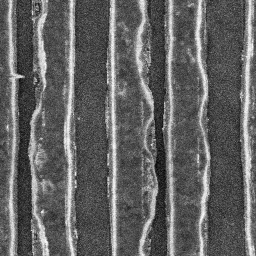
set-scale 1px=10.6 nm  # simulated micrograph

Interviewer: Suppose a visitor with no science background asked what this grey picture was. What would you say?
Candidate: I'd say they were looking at one or a few lines or trenches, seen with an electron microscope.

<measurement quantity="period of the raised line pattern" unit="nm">700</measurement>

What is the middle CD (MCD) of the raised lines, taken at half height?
0.33 micrometres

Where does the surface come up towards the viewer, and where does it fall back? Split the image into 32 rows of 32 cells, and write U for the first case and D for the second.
UDDDDUUUUDDDDDUUUUDDDUUUUDDDDDDU
UDDDDUUUUDDDDDUUUUDDDUUUUDDDDDDU
UDDDDUUUUDDDDDUUUUDDDUUUUDDDDDDU
UDDDDUUUUDDDDDUUUUDDDUUUUDDDDDDU
UDDDDUUUUDDDDDUUUDDDDUUUUDDDDDDU
UDDDDUUUUDDDDDUUUDDDDUUUUDDDDDDU
UDDDDUUUUDDDDDUUUDDDDUUUUDDDDDDU
UDDDDUUUUDDDDDUUUDDDDUUUUDDDDDDU
UDDDDUUUUDDDDDUUUDDDDUUUUDDDDDDU
UUDDDUUUUDDDDDUUUUDDDUUUUDDDDDDU
UUDDDDUUUDDDDDUUUUDDDUUUUUDDDDDU
UUDDDUUUUDDDDDUUUUDDDUUUUUDDDDDU
UUDDDUUUUDDDDDUUUUUDDUUUUDDDDDDU
UUDDDUUUUDDDDDUUUUUDDUUUUDDDDDDU
UUDDUUUUUDDDDDUUUUUDDUUUUDDDDDDU
UUDDUUUUUDDDDDUUUUUDDUUUUDDDDDDU
UUDDUUUUDDDDDDUUUUDDDUUUUDDDDDDU
UUDDUUUUDDDDDDUUUUDDDUUUUUDDDDDU
UUDDUUUUUDDDDDUUUUDDDUUUUUDDDDDU
UUDDUUUUUDDDDDUUUUUDDUUUUUDDDDDU
UUDDUUUUUDDDDDUUUUUDDUUUUUDDDDDU
UUDDUUUUUDDDDDUUUUUDDUUUUUDDDDDU
UDDDUUUUUDDDDDUUUUUUDUUUUUDDDDDU
UDDDUUUUUDDDDDUUUUUUDUUUUUDDDDDU
UDDDUUUUUDDDDDUUUUUDDUUUUUDDDDDU
UDDDUUUUUDDDDDUUUUUDDUUUUDDDDDDU
UDDDUUUUUDDDDDUUUUUDDDUUUDDDDDDU
UDDDDUUUUDDDDDUUUUUDDDUUUDDDDDDU
UUDDDUUUUDDDDDUUUUDDDUUUUDDDDDDU
UUDDDUUUUDDDDDUUUUDDDUUUUDDDDDDU
UDDDDUUUUDDDDDUUUUDDDUUUUDDDDDDU
UDDDDUUUUDDDDDUUUUDDDDUUUDDDDDDU